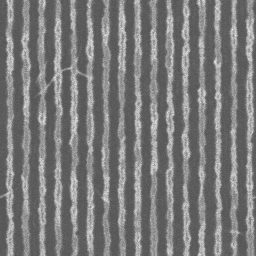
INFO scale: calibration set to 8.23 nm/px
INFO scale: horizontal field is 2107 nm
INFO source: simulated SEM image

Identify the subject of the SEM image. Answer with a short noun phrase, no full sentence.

parallel lines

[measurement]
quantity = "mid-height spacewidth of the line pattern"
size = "79.2 nanometers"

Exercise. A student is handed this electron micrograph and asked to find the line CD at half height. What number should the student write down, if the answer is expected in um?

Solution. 0.0576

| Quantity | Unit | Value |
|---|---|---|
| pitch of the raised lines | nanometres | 132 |